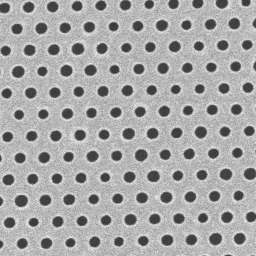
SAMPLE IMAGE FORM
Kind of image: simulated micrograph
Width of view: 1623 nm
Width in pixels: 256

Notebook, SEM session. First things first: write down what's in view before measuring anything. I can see a regular array of holes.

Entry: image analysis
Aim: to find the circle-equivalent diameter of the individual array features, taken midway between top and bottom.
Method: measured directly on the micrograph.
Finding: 68.5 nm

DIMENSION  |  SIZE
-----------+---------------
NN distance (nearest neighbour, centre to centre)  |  24 px